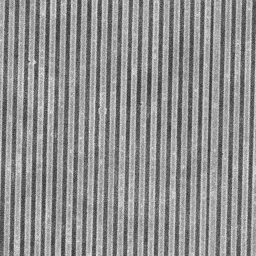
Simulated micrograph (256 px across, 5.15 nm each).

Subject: parallel lines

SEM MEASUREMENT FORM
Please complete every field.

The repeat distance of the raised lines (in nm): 53.1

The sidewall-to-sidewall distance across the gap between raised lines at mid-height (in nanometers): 27.7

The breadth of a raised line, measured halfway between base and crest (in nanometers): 27.7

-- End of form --